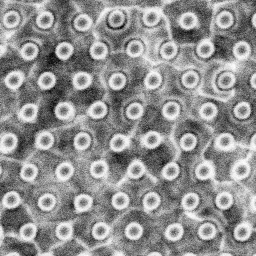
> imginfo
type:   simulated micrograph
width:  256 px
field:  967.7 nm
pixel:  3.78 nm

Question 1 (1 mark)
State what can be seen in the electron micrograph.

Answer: a regular array of raised bodies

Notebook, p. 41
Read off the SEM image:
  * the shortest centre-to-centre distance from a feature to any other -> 124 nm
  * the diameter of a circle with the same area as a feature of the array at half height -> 62.5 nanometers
